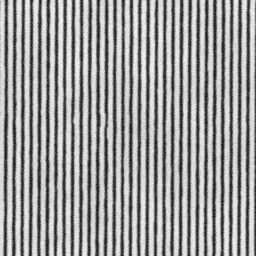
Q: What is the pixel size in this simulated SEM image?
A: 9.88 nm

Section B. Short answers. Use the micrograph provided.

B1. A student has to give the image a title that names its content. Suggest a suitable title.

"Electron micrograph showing parallel lines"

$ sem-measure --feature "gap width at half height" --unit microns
0.0346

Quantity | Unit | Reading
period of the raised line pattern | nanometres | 82.4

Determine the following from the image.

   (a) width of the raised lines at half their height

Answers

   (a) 42 nm